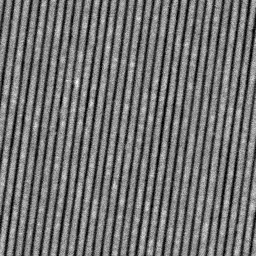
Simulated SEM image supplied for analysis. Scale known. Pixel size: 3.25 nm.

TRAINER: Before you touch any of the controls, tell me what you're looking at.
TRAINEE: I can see parallel lines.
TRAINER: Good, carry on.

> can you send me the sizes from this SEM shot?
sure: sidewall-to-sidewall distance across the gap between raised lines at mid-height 8.4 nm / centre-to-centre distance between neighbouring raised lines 28.2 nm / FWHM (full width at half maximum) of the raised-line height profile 19.3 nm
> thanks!